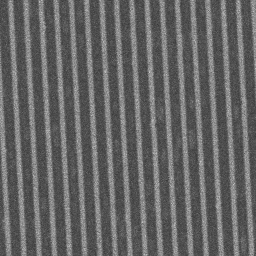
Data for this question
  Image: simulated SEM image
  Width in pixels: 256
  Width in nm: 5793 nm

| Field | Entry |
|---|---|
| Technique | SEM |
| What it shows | parallel lines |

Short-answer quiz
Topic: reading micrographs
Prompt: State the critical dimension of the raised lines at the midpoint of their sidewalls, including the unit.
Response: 81.9 nanometers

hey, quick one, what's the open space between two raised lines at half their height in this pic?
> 263 nm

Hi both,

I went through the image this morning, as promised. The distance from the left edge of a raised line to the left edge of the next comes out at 343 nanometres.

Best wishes